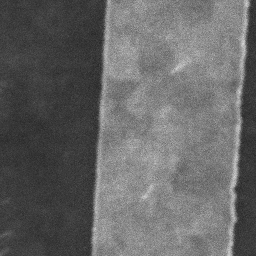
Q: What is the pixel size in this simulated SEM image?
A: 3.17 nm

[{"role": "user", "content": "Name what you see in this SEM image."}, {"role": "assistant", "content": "one or a few lines or trenches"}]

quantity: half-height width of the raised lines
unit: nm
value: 438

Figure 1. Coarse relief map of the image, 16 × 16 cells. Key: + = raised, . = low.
.......++++++++.
.......++++++++.
.......++++++++.
.......++++++++.
.......++++++++.
......+++++++++.
......+++++++++.
......+++++++++.
......+++++++++.
......+++++++++.
......+++++++++.
......+++++++++.
......+++++++++.
......+++++++++.
......++++++++..
......++++++++..